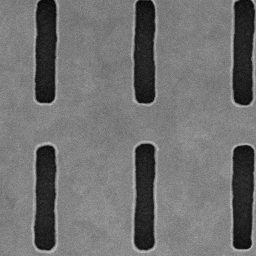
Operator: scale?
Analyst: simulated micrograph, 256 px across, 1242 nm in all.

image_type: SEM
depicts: holes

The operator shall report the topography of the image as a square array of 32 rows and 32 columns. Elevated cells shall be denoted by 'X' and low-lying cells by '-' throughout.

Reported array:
XXXXX--XXXXXXXXXX--XXXXXXXXXX---
XXXX---XXXXXXXXXX--XXXXXXXXXX---
XXXX---XXXXXXXXXX---XXXXXXXXX---
XXXX---XXXXXXXXXX---XXXXXXXXX---
XXXX---XXXXXXXXXX--XXXXXXXXXX---
XXXX---XXXXXXXXXX--XXXXXXXXXX---
XXXX---XXXXXXXXXX--XXXXXXXXXX---
XXXX---XXXXXXXXXX--XXXXXXXXXX---
XXXX---XXXXXXXXXX--XXXXXXXXXX---
XXXX---XXXXXXXXXX---XXXXXXXXX---
XXXX---XXXXXXXXXX---XXXXXXXXX---
XXXX---XXXXXXXXXX---XXXXXXXXX---
XXXX---XXXXXXXXXX--XXXXXXXXXX---
XXXXXXXXXXXXXXXXXXXXXXXXXXXXXXXX
XXXXXXXXXXXXXXXXXXXXXXXXXXXXXXXX
XXXXXXXXXXXXXXXXXXXXXXXXXXXXXXXX
XXXXXXXXXXXXXXXXXXXXXXXXXXXXXXXX
XXXXXXXXXXXXXXXXXXXXXXXXXXXXXXXX
XXXXX--XXXXXXXXXX--XXXXXXXXXX---
XXXX---XXXXXXXXXX---XXXXXXXXX---
XXXX---XXXXXXXXXX---XXXXXXXXX---
XXXX---XXXXXXXXXX--XXXXXXXXXX---
XXXX---XXXXXXXXXX--XXXXXXXXXX---
XXXX---XXXXXXXXXX--XXXXXXXXXX---
XXXX---XXXXXXXXXX--XXXXXXXXXX---
XXXX---XXXXXXXXXX--XXXXXXXXXX---
XXXX---XXXXXXXXXX--XXXXXXXXXX---
XXXX---XXXXXXXXXX--XXXXXXXXXX---
XXXX---XXXXXXXXXX--XXXXXXXXXX---
XXXX---XXXXXXXXXX--XXXXXXXXXX--X
XXXX---XXXXXXXXXX--XXXXXXXXXX--X
XXXXXXXXXXXXXXXXXXXXXXXXXXXXXXXX